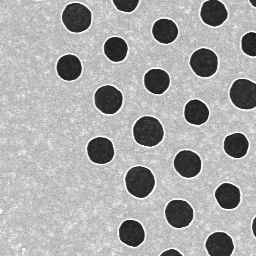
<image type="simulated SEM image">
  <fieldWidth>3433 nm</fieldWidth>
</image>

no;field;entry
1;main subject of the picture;a regular array of holes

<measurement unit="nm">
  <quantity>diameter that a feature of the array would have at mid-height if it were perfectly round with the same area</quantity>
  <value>362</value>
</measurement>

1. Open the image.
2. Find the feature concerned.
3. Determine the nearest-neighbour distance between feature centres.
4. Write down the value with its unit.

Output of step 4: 0.675 micrometres